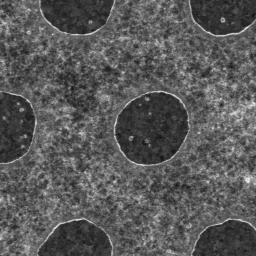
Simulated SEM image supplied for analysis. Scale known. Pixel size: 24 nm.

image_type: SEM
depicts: raised bodies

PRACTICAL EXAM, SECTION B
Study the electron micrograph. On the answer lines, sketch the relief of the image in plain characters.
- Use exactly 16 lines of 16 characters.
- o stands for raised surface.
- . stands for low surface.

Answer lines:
...oooo.....oooo
...oooo.....oooo
................
................
................
................
oo......ooo.....
oo.....ooooo....
oo.....ooooo....
oo......ooo.....
................
................
................
................
...oooo......ooo
...oooo.....oooo